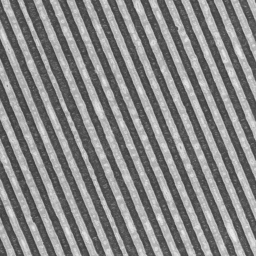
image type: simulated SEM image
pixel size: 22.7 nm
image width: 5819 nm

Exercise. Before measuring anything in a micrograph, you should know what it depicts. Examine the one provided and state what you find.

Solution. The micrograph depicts parallel lines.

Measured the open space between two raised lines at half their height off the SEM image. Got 184 nm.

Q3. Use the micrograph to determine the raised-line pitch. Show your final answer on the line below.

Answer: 345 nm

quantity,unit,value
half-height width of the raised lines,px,7.16